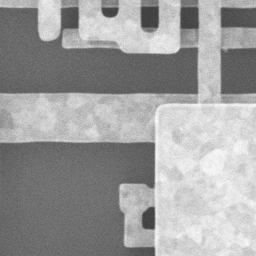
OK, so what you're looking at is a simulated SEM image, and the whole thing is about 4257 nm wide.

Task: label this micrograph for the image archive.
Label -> wiring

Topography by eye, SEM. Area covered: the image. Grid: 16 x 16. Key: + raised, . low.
................
................
................
................
................
................
................
..........++++++
..........++++++
..........++++++
..........++++++
..........++++++
..........++++++
..........++++++
..........++++++
..........++++++